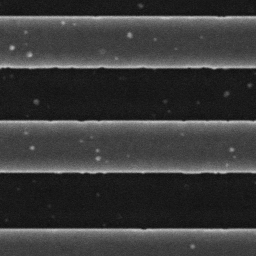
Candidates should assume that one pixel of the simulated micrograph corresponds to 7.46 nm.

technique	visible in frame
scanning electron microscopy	lines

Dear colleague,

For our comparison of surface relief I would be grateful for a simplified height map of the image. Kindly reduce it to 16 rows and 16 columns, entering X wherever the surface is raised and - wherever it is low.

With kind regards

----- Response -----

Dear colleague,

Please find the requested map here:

----------------
XXXXXXXXXXXXXXXX
XXXXXXXXXXXXXXXX
XXXXXXXXXXXXXXXX
----------------
----------------
----------------
----------------
XXXXXXXXXXXXXXXX
XXXXXXXXXXXXXXXX
XXXXXXXXXXXXXXXX
----------------
----------------
----------------
XXXXXXXXXXXXXXXX
XXXXXXXXXXXXXXXX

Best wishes